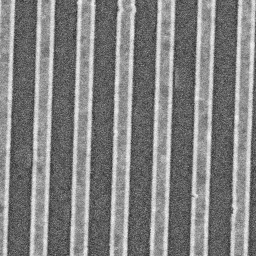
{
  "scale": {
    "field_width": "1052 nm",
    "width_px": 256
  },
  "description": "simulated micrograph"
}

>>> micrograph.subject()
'parallel lines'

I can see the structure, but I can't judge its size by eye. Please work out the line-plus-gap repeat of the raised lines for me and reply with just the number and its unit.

165 nanometers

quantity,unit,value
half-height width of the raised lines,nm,56.5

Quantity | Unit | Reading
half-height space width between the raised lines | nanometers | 109